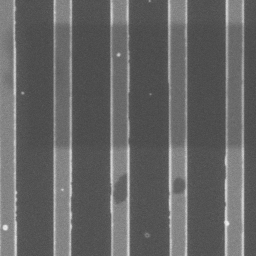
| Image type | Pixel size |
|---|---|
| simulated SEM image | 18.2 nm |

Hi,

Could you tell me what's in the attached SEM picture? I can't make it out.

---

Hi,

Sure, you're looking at lines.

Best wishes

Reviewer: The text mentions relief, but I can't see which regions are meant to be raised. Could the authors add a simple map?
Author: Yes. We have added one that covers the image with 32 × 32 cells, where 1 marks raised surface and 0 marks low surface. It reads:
11000001100000110000011000001100
11000001100000110000011000001100
11000001100000110000011000001100
11000001100000110000011000001100
11000001100000110000011000001100
11000001100000110000011000001100
11000001100000110000011000001100
11000001100000110000011000001100
11000001100000110000011000001100
11000001100000110000011000001100
11000001100000110000011000001100
11000001100000110000011000001100
11000001100000110000011000001100
11000001100000110000011000001100
11000001100000110000011000001100
11000001100000110000011000001100
11000001100000110000011000001100
11000001100000110000011000001100
11000001100000110000011000001100
11000001100000110000011000001100
11000001100000110000011000001100
11000001100000110000011000001100
11000001100000110000011000001100
11000001100000110000011000001100
11000001100000110000011000001100
11000001100000110000011000001100
11000001100000110000011000001100
11000001100000110000011000001100
11000001100000110000011000001100
11000001100000110000011000001100
11000001100000110000011000001100
11000001100000110000011000001100